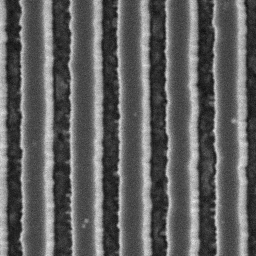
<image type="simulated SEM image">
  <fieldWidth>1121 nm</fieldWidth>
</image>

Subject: lines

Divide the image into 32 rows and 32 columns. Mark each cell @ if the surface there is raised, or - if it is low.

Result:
--@@@@---@@@---@@@---@@@---@@@--
---@@@---@@@---@@@---@@@---@@@--
--@@@@---@@@---@@@---@@@---@@@--
---@@@---@@@---@@@---@@@---@@@--
@--@@@---@@@@--@@@---@@@---@@@--
---@@@---@@@---@@@---@@@---@@@--
---@@@---@@@---@@@---@@@---@@@--
---@@@---@@@@--@@@---@@@---@@@--
---@@@---@@@@--@@@---@@@---@@@--
---@@@---@@@@--@@@---@@@---@@@--
---@@@---@@@@--@@@---@@@---@@@--
@--@@@---@@@@--@@@---@@@---@@@--
@--@@@---@@@@--@@@---@@@---@@@--
---@@@---@@@@--@@@---@@@@--@@@--
@--@@@---@@@@--@@@---@@@---@@@--
---@@@---@@@@--@@@---@@@---@@@--
@--@@@---@@@@--@@@---@@@---@@@--
@--@@@---@@@@--@@@---@@@---@@@--
@--@@@---@@@@--@@@---@@@---@@@@-
@--@@@---@@@@--@@@---@@@---@@@@-
@--@@@---@@@@--@@@---@@@---@@@@-
@--@@@---@@@@--@@@---@@@---@@@--
---@@@---@@@@--@@@@--@@@---@@@@-
@--@@@---@@@@--@@@---@@@---@@@--
@--@@@---@@@@--@@@---@@@---@@@--
@--@@@---@@@@--@@@@--@@@---@@@--
@--@@@---@@@@--@@@@--@@@---@@@--
@--@@@---@@@@--@@@@--@@@---@@@@-
@--@@@---@@@@--@@@---@@@---@@@@-
@--@@@---@@@@--@@@---@@@---@@@@-
@--@@@---@@@@--@@@@--@@@@--@@@@-
@--@@@---@@@@--@@@@--@@@---@@@@-